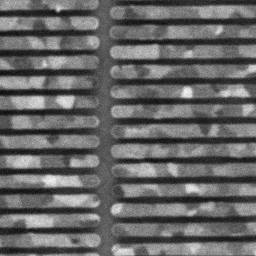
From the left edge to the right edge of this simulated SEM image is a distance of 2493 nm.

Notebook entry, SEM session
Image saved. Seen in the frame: groups of lines, slits or small figures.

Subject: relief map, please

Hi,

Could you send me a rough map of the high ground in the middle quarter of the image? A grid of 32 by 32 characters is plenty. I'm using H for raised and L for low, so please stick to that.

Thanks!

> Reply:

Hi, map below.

HHHHHHHHLLLLLLLLLLLLLLLLLLLLLLLL
LLLLLLLLLLLLHHHHHHHHHHHHHHHHHHHH
LLLLLLLLLLLLHHHHHHHHHHHHHHHHHHHH
HHHHHHHHLLLLLLLLLLLLLLLLLLLLLLLL
HHHHHHHHLLLLLLLLLLLLLLLLLLLLLLLL
HHHHHHHHLLLLLLLLLLLLLLLLLLLLLLLL
LLLLLLLLLLLLHHHHHHHHHHHHHHHHHHHH
LLLLLLLLLLLLHHHHHHHHHHHHHHHHHHHH
HHHHHHHHLLLLLLLLLLLLLLLLLLLLLLLL
HHHHHHHHLLLLLLLLLLLLLLLLLLLLLLLL
HHHHHHHHLLLLLLLLLHHHHHHHHHHHHHHH
LLLLLLLLLLLLHHHHHHHHHHHHHHHHHHHH
LLLLLLLLLLLLHHHHHHHHHHHHHHHHHHHH
HHHHHHHHLLLLLLLLLLLLLLLLLLLLLLLL
HHHHHHHHLLLLLLLLLLLLLLLLLLLLLLLL
HHHHHHHHLLLLLLLLLLHHHHHHHHHHHHHH
LLLLLLLLLLLLHHHHHHHHHHHHHHHHHHHH
LLLLLLLLLLLLHHHHHHHHHHHHHHHHHHHH
HHHHHHHHLLLLLLLLLLLLLLLLLLLLLLLL
HHHHHHHHLLLLLLLLLLLLLLLLLLLLLLLL
HHHHHHHHLLLLLHHHHHHHHHHHHHHHHHHH
LLLLLLLLLLLLHHHHHHHHHHHHHHHHHHHH
LLLLLLLLLLLLHHHHHHHHHHHHHHHHHHHH
HHHHHHHHLLLLLLLLLLLLLLLLLLLLLLLL
HHHHHHHHLLLLLLLLLLLLLLLLLLLLLLLL
HHHHHHHHLLLLLHHHHHHHHHHHHHHHHHHH
LLLLLLLLLLLLHHHHHHHHHHHHHHHHHHHH
LLLLLLLLLLLLHHHHHHHHHHHHHHHHHHHH
HHHHHHHHLLLLLLLLLLLLLLLLLLLLLLLL
HHHHHHHHHLLLLLLLLLLLLLLLLLLLLLLL
LLLLHHHHLLLLLHHHHHHHHHHHHHHHHHHH
LLLLLLLLLLLLHHHHHHHHHHHHHHHHHHHH